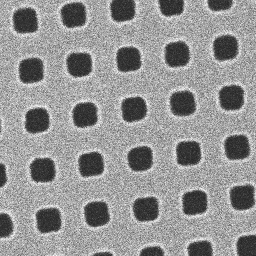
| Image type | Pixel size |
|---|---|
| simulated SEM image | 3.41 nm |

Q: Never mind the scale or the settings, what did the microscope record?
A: a regular array of holes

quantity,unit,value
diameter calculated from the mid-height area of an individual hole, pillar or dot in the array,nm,87.6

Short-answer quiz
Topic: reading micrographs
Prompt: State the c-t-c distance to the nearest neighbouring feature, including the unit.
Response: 166 nanometers